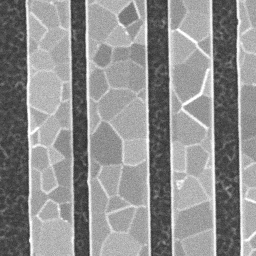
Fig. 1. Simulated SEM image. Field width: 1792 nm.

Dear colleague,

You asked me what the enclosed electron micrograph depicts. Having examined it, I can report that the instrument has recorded one or a few lines or trenches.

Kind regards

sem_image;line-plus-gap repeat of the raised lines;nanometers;496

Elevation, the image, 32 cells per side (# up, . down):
...######..#######...#####....##
...######..#######...#####....##
...######..#######...#####....##
...######..#######...#####....##
...######..#######...#####....##
....#####..#######...#####....##
....#####..#######...#####....##
....#####..#######...#####....##
....#####..#######...#####....##
....#####..#######...######...##
...######..#######...######...##
....#####..#######...######...##
...######..#######...######...##
....#####..#######...######...##
....#####..#######...######...##
....#####..#######...######...##
....#####..#######...######...##
....#####..#######...######...##
....#####..#######...######...##
....#####..#######...######...##
....#####..########..######...##
....#####..########..######...##
....#####..########..######...##
....#####..########...#####...##
....#####..########...#####...##
....#####..########...#####...##
....#####..########...#####...##
....#####..########...#####...##
....#####..########...#####...##
....#####..########...#####...##
....#####..########...#####...##
....#####..########...#####...##